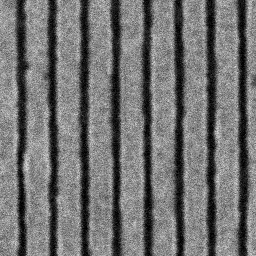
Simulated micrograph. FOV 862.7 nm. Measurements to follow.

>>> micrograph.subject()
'parallel lines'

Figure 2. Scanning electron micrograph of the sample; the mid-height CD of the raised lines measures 77.9 nm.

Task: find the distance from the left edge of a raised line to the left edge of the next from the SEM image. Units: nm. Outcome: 106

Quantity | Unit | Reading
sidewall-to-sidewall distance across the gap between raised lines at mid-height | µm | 0.0282